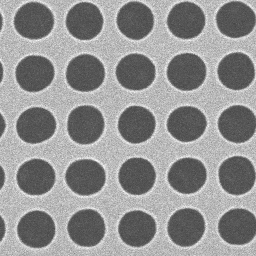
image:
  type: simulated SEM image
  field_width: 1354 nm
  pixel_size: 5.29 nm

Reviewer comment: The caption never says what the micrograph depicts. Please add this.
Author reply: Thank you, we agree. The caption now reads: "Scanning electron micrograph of a regular array of holes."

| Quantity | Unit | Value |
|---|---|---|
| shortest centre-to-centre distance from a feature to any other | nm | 265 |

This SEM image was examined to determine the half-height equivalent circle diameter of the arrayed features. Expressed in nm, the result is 201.